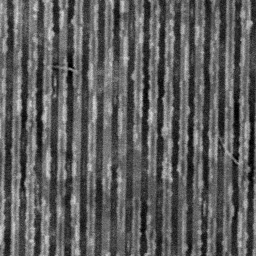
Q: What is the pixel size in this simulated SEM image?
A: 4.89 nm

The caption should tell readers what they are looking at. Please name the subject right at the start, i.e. parallel lines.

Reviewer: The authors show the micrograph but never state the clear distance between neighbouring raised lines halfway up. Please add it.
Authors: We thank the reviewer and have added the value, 33.6 nm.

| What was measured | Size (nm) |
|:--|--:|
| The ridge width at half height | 37.9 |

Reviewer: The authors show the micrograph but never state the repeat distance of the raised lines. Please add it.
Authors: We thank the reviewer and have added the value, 74.1 nanometres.